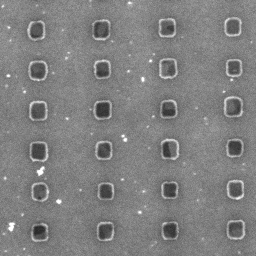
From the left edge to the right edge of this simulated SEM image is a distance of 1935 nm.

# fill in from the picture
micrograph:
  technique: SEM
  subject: a regular array of raised bodies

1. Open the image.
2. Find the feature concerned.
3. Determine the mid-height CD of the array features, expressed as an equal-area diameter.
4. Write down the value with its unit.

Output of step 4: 0.137 um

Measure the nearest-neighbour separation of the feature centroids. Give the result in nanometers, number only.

304